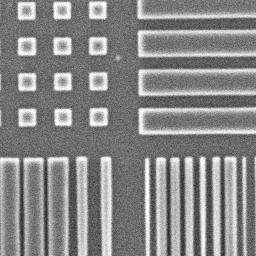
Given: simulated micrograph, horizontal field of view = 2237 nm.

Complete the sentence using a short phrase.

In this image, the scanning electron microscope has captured groups of lines, slits or small figures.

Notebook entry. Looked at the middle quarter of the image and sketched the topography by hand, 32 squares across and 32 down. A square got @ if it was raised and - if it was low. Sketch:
--------------------------------
--------------------------------
-------------------@@@@@@@@@@@@@
@@-----@@@---------@@@@@@@@@@@@@
@@-----@@@---------@@@@@@@@@@@@@
@@-----@@@---------@@@@@@@@@@@@@
-------------------@@@@@@@@@@@@@
-------------------@@@@@@@@-----
--------------------------------
--------------------------------
--------------------------------
-------@@@---------@@@@@@@@@@@@@
@------@@@---------@@@@@@@@@@@@@
@@-----@@@---------@@@@@@@@@@@@@
@@-----@@@---------@@@@@@@@@@@@@
-------------------@@@@@@@@@@@@@
-------------------@@@@@@@@@@@@@
--------------------------------
--------------------------------
--------------------------------
--------------------------------
--------------------------------
--------------------------------
--------------------------------
@---@@----@------------@@--@---@
@---@@----@------------@@--@---@
@---@@----@------------@@--@@--@
@---@@----@@-----------@@--@@--@
@---@@----@@-----------@@--@@--@
@---@-----@@-----------@@--@@--@
@---@-----@@-----------@@--@@-@@
@---@-----@@-----------@@--@@-@@